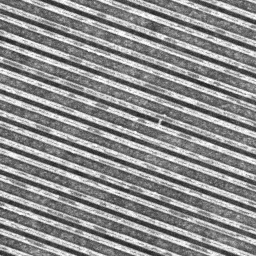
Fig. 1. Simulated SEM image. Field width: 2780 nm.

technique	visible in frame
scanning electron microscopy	parallel lines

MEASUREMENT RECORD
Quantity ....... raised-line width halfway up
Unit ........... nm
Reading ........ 47.3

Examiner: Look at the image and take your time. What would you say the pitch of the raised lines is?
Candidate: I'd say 137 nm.